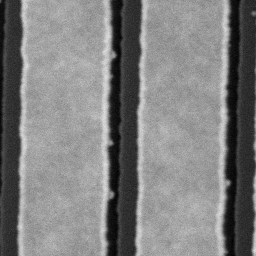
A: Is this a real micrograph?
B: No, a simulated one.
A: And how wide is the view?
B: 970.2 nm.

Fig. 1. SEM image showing lines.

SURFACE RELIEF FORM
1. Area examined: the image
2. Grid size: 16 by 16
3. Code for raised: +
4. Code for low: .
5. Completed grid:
.++++++..+++++..
.++++++..+++++..
.++++++..+++++..
.++++++..+++++..
.++++++..+++++..
.++++++..+++++..
.++++++..+++++..
.++++++..+++++..
.++++++..+++++..
.++++++..+++++..
.++++++..+++++..
.++++++..+++++..
.++++++..+++++..
.++++++..+++++..
.++++++..+++++..
.++++++..+++++..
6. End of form